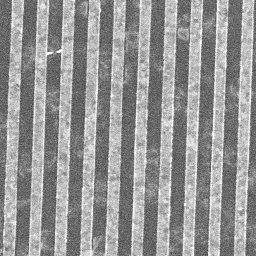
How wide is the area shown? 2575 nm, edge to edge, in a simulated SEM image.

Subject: parallel lines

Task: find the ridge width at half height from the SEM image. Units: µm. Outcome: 0.109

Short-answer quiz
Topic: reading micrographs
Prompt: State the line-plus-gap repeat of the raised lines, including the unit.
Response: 258 nanometres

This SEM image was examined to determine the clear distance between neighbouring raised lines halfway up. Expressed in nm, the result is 152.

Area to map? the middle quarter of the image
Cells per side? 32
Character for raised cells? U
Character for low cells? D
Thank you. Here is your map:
UUDDDDUUDDDDUUUDDDDUUDDDDUUUDDDD
UUDDDDUUDDDDUUUDDDDUUDDDDUUUDDDD
UUDDDDUUDDDDUUUDDDDUUDDDDUUDDDDU
UUDDDDUUDDDDUUUDDDDUUDDDDUUDDDDU
UUDDDDUUDDDDUUUDDDDUUDDDDUUDDDDU
UUDDDDUUDDDDUUUDDDDUUDDDDUUDDDDU
UUDDDDUUDDDDUUUDDDDUUDDDDUUDDDDU
UUDDDDUUDDDDUUDDDDUUUDDDDUUDDDDU
UUDDDDUUDDDDUUDDDDUUUDDDDUUDDDDU
UUDDDDUUDDDDUUDDDDUUUDDDDUUDDDDU
UUDDDDUUDDDDUUDDDDUUUDDDDUUDDDDU
UUDDDDUUDDDDUUDDDDUUUDDDDUUDDDDU
UDDDDDUUDDDDUUDDDDUUUDDDDUUDDDDU
UDDDDUUUDDDDUUDDDDUUUDDDDUUDDDDU
UDDDDUUUDDDDUUDDDDUUUDDDDUUDDDDU
UDDDDUUUDDDDUUDDDDUUUDDDDUUDDDDU
UDDDDUUUDDDDUUDDDDUUDDDDUUUDDDDU
UDDDDUUUDDDDUUDDDDUUDDDDUUUDDDDU
UDDDDUUUDDDDUUDDDDUUDDDDUUUDDDDU
UDDDDUUUDDDDUUDDDDUUDDDDUUUDDDDU
UDDDDUUUDDDDUUDDDDUUDDDDUUUDDDDU
UDDDDUUDDDDUUUDDDDUUDDDDUUUDDDDU
UDDDDUUDDDDUUUDDDDUUDDDDUUUDDDDU
UDDDDUUUDDDUUUDDDDUUDDDDUUUDDDDU
UDDDDUUUDDDUUUDDDDUUDDDDUUUDDDDU
UDDDDUUUDDDUUUDDDDUUDDDDUUUDDDDU
UDDDDUUUDDDUUUDDDDUUDDDDUUUDDDDU
UDDDDUUDDDDUUUDDDDUUDDDDUUUDDDDU
UDDDDUUDDDDUUUDDDDUUDDDDUUUDDDDU
UDDDDUUDDDDUUUDDDDUUDDDDUUUDDDDU
UDDDDUUDDDDUUUDDDDUUDDDDUUDDDDUU
UDDDDUUDDDDUUUDDDDUUDDDDUUDDDDUU